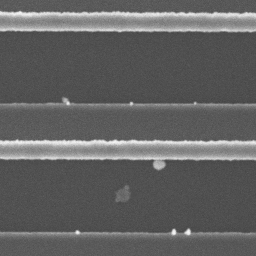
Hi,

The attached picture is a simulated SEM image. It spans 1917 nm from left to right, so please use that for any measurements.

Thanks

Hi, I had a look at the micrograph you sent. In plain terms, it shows lines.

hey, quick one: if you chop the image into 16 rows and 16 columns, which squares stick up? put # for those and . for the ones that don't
################
################
................
................
................
................
...##.......#...
################
################
################
................
................
................
................
...........#....
################